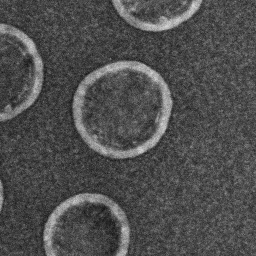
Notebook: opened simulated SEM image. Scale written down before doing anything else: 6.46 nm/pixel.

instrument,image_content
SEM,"raised bodies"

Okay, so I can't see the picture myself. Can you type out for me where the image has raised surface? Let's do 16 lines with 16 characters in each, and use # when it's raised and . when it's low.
........####....
.........##.....
##..............
##..............
##....###.......
##...#####......
##...#####......
.....#####......
.....#####......
.......#........
................
................
.....#..........
...#####........
...#####........
...#####........